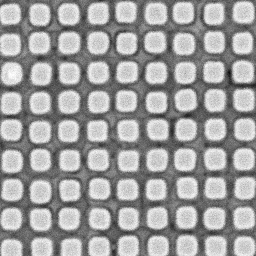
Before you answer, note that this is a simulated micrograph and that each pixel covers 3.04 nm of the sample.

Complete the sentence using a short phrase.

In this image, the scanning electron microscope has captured a regular array of raised bodies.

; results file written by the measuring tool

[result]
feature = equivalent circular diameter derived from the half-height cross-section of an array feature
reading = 68.4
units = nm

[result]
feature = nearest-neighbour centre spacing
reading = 0.0859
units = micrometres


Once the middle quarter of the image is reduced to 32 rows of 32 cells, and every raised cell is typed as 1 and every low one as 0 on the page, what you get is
11110011111001111100011110001111
11110011111001111100011111001111
11110011111001111100011111001111
11110011111001111100011111001111
11110001110000000000011110001111
00000000000000000000000000000000
00000000000000000000000000000111
11110001111001111100011110001111
11110011111001111100011111001111
11110011111001111100011111001111
11110011111001111100011111001111
11100011111000111000011110001111
00000000000000000000000000000000
00000000000000000000000000000000
11100001110000111100011111001111
11100011111000111100011111001111
11100011111000111100011111001111
11110011111000111100011111001111
11110011111000111100001111001111
00000000000000000000000000000000
00000000000000000000000000000000
00000001110000000000001110000111
11110011111000111110011111001111
11110011111000111110011111001111
11110011111000111110011111001111
11110011111000111110011111001111
11100001100000111100011110000111
00000000000000000000000000000000
00000000000000000000000000000111
11110001111000111100011110001111
11110011111001111100011110001111
11110011111101111110011110001111